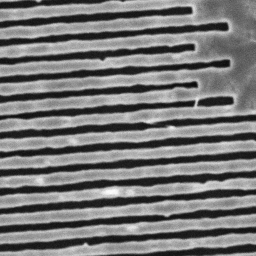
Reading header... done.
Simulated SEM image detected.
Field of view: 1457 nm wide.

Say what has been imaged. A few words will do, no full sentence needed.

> parallel lines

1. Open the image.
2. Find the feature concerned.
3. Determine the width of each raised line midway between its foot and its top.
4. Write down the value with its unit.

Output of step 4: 10.7 px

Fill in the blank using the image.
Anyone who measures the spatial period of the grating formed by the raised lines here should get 106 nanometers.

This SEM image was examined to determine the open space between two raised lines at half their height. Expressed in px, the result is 7.73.